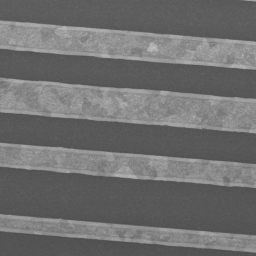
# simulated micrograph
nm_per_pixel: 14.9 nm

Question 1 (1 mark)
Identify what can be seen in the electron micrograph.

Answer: one or a few lines or trenches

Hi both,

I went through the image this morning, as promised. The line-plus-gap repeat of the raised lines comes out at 932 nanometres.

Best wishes